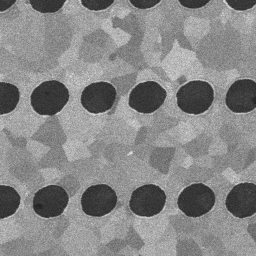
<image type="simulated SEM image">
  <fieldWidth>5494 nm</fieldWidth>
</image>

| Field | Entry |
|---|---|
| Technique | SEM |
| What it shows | a regular array of holes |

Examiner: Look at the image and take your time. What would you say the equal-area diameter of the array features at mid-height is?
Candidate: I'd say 35.3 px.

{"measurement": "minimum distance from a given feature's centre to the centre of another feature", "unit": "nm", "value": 1040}